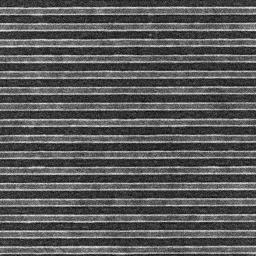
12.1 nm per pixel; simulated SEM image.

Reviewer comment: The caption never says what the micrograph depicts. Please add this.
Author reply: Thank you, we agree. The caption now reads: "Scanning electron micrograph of parallel lines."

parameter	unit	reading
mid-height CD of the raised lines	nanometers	84.7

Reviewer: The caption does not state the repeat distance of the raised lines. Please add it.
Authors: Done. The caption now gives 15.9 pixels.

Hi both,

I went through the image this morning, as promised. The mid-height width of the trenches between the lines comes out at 0.107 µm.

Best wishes